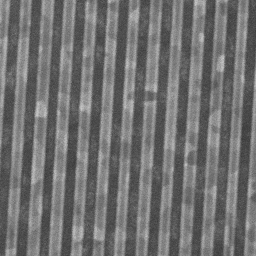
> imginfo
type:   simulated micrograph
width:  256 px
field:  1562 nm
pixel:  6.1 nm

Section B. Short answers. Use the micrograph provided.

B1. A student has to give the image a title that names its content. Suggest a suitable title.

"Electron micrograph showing parallel lines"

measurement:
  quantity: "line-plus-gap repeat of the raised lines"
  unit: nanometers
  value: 132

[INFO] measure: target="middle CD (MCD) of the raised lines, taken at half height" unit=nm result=57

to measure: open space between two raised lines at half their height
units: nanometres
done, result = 74.5